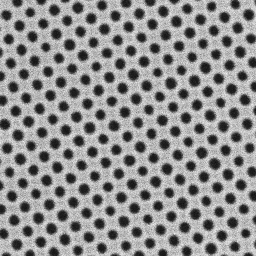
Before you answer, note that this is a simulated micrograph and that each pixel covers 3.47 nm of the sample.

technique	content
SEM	a regular array of holes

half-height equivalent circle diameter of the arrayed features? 35.3 nm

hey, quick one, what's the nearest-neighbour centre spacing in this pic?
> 58.5 nanometres